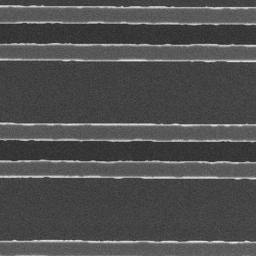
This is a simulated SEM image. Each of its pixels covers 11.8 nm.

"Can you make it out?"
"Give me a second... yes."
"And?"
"lines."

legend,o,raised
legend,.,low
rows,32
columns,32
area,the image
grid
................................
oooooooooooooooooooooooooooooooo
oooooooooooooooooooooooooooooooo
................................
................................
.oooo.ooo.......................
oooooooooooooooooooooooooooooooo
........oooooooooooooooooooooooo
................................
................................
................................
................................
................................
................................
................................
oo..............................
oooooooooooooooooooooooooooooooo
..oooooooooooooooooooooooooooooo
................................
................................
oooooooooooooooooooooooooooooooo
oooooooooooooooooooooooooooooooo
................................
................................
................................
................................
................................
................................
................................
................................
oooooooooooooooooooooooooooooooo
oooooooooooooooooooooooooooooooo